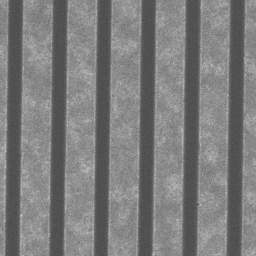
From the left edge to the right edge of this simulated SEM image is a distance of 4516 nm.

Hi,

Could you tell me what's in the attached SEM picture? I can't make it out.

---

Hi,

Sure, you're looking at parallel lines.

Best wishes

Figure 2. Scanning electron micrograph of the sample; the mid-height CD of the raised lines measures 569 nanometers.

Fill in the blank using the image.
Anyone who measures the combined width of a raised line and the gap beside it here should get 782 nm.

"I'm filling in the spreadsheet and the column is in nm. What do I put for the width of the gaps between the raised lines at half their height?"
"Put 225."